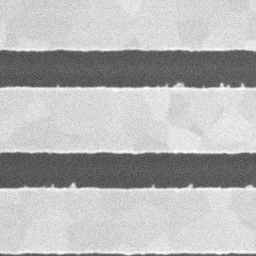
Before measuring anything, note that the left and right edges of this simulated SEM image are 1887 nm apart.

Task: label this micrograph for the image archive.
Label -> lines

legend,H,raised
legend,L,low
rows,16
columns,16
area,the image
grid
HHHHHHHHHHHHHHHH
HHHHHHHHHHHHHHHH
HHHHHHHHHHHHHHHH
LLLLLLLLLLLLLLLL
LLLLLLLLLLLLLLLL
HHLLHLHLLHHLLLLL
HHHHHHHHHHHHHHHH
HHHHHHHHHHHHHHHH
HHHHHHHHHHHHHHHH
LLHHHHLHHHHHHHHH
LLLLLLLLLLLLLLLL
LLLLLLLLLLLLLLLL
HHHHHHHHHHHHHHHH
HHHHHHHHHHHHHHHH
HHHHHHHHHHHHHHHH
HHHHHHHHHHHHHHHH